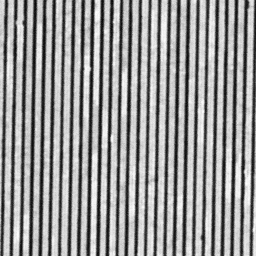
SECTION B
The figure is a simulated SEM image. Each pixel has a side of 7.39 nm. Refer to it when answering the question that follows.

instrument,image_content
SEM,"parallel lines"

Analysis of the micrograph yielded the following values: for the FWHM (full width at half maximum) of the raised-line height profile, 36 nm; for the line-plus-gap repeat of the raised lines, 9.58 pixels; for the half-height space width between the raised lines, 29.5 nm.